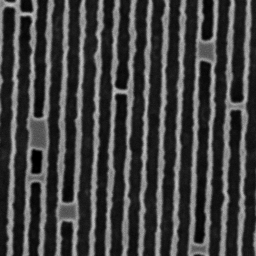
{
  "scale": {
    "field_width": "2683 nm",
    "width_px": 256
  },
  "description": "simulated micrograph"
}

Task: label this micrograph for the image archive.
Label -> parallel lines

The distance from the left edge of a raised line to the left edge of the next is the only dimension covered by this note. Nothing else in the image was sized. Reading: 172 nm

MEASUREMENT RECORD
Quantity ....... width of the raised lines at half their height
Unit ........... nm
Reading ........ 53.6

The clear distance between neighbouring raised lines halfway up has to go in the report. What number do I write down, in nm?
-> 116